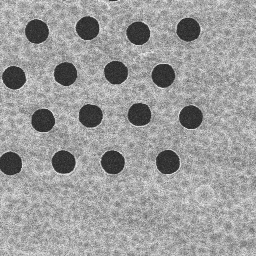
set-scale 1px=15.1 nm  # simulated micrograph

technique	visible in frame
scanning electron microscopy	a regular array of holes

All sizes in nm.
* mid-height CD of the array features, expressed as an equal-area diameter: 359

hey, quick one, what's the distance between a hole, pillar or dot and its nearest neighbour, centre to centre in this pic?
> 740 nm